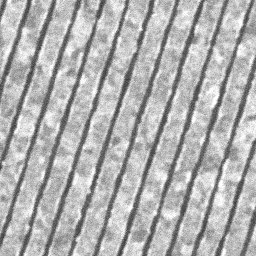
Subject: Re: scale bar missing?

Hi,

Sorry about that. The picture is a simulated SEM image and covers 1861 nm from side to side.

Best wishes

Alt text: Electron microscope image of parallel lines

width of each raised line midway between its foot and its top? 123 nm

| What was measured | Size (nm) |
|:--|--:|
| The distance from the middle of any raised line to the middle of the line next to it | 170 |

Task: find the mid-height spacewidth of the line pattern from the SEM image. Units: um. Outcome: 0.0458